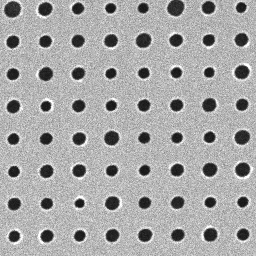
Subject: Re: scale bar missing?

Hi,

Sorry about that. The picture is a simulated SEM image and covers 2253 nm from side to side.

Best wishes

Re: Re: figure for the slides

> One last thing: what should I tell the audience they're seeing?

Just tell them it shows a regular array of holes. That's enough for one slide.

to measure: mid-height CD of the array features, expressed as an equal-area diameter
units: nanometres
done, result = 112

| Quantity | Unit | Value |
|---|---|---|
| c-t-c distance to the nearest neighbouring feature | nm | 284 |